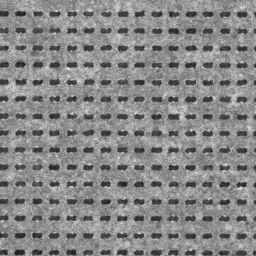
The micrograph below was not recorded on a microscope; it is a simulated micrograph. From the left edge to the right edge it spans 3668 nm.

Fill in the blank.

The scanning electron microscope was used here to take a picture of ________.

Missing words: a regular array of holes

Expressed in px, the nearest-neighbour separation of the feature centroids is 16.6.